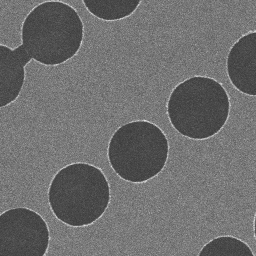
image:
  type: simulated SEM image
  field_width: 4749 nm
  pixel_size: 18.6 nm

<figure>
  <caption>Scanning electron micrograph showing holes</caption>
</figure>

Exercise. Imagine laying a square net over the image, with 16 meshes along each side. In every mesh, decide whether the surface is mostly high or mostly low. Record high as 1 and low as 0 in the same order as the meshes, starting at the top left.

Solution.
1100100011111111
1000011111111111
1000011111111110
0000111111111100
0011111111111100
0111111111100010
1111111111100011
1111111111100011
1111111000110111
1111111000111111
1111001000111111
1110000111111111
1110000111111111
0011001111111111
0001111111111111
0001111111111000